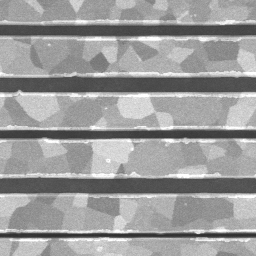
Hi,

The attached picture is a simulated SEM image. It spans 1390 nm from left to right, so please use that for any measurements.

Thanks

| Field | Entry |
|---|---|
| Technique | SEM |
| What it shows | parallel lines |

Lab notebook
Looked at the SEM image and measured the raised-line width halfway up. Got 207 nanometres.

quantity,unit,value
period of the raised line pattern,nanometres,284